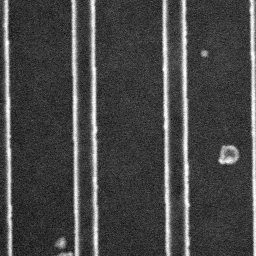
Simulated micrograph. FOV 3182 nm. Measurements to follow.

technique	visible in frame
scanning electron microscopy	lines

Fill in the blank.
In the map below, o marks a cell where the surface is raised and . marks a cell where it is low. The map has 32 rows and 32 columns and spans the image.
o........ooo........ooo........o
o........ooo........ooo........o
o........ooo........ooo........o
o........ooo........ooo........o
o........ooo........ooo........o
o........ooo.........oo........o
o........ooo.........oo........o
o........ooo.........oo.........
o........ooo........ooo.........
o........ooo.........oo.........
o........ooo.........oo.........
o........ooo.........oo.........
o........ooo.........oo.........
o........ooo.........oo.........
o........ooo.........oo.........
o........ooo.........oo.........
o........ooo.........oo.........
o........ooo.........oo.........
o........ooo.........oo.........
o........ooo.........oo.....o...
o........ooo.........oo.........
o........ooo.........oo.........
o........ooo.........oo.........
o........ooo.........oo.........
o........ooo.........oo.........
o........ooo.........oo.........
o........ooo.........oo.........
o........ooo.........oo.........
o........ooo.........oo.........
o........ooo.........oo.........
o........ooo.........ooo........
o........ooo.........oo.........